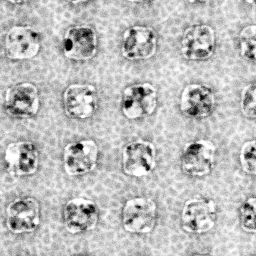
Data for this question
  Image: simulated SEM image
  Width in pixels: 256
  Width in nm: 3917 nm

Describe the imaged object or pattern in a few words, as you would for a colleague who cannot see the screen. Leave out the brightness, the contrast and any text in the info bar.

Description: a regular array of raised bodies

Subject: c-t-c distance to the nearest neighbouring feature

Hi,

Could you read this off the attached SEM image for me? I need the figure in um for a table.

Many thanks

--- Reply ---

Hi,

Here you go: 0.879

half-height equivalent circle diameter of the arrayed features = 506 nm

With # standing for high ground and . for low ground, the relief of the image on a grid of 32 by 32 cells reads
................................
................................
................................
.........##......##.....##.....#
.####...####....###....####...##
.####...####...####....####...##
.####...####...####....###....##
................................
................................
................................
................................
.####...####....###....####....#
.####...####....###....####...##
.####...####...####....###....##
................#.......#......#
................................
................................
................................
.###....####....###....####...##
.####...####....###....####...##
.####...####....###....####...##
.###.....#......###....###.....#
................................
................................
................................
.####....###....###....####....#
.####...####....###....####...##
.####...####....###....####...##
.###....###.....###....###.....#
................................
................................
................................